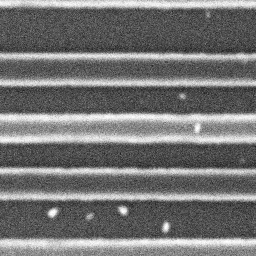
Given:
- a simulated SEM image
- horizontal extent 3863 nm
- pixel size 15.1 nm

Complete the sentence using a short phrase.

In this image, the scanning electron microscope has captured lines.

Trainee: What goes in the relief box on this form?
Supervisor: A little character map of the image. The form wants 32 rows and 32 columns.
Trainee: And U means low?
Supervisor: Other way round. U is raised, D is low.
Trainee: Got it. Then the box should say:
DDDDDDDUUUUUUDDUUUUUUUUUUUUUUUUU
DDDDDDDDDDDDDDDDDDDDDDDDDDDDDDDD
DDDDDDDDDDDDDDDDDDDDDDDDDDDDDDDD
DDDDDDDDDDDDDDDDDDDDDDDDDDDDDDDD
DDDDDDDDDDDDDDDDDDDDDDDDDDDDDDDD
DDDDDDDDDDDDDDDDDDDDDDDDDDDDDDDD
DDDDDDDDDDDDDDDDDDDDDDDDDDDDDDDD
UUUUUUUUUUUUUUUUUUUUUUUUUUUUUUUU
UUUUUUUUUUUUUUUUUUUUUUUUUUUUUUUU
UUUUUUUUUUUUUUUUUUUUUUUUUUUUUUUU
UUUUDUDDDDDUDDUDUUDUUUDUUUUUUUUU
DDDDDDDDDDDDDDDDDDDDDDDDDDDDDDDD
DDDDDDDDDDDDDDDDDDDDDDDDDDDDDDDD
DDDDDDDDDDDDDDDDDDDDDDDDDDDDDDDD
DDDDDDDDDDDDDDDDUDDDDDDDDDDDDDDD
UUUUUUUUUUUUUUUUUUUUUUUUUUUUUUUU
UUUUUUUUUUUUUUUUUUUUUUUUUUUUUUUU
UUDDDDDDDDDDDDDDUUDDDDDDDUDUDDDD
DDDDDDDDDDDDDDDDDDDDDDDDDDDDDDDD
DDDDDDDDDDDDDDDDDDDDDDDDDDDDDDDD
DDDDDDDDDDDDDDDDDDDDDDDDDDDDDDDD
UUUUUUUUUUUUUUUUUUUUUUUUUUUUUUUU
UUUUUUUUUUUUUUUUUUUUUUUUUUUUUUUU
UUUUUUUUUUUUUUUUUUUUUUUUUUUUUUUU
UUUUUUUUUUUUUUUUUUUUUUUUUUUUUUUU
DDDDDDDDDDDDDDDDDDDDDDDDDDDDDDDD
DDDDDDDDDDDDDDDDDDDDDDDDDDDDDDDD
DDDDDDDDDDDDDDDDDDDDDDDDDDDDDDDD
DDDDDDDDDDDDDDDDDDDDDDDDDDDDDDDD
DDDDDDDDDDDDDDDDDDDDDDDDDDDDDDDD
UUUUUUUUUUUUUUUUUUUUUUUUUUUUUUUU
UUUUUUUUUUUUUUUUUUUUUUUUUUUUUUUU